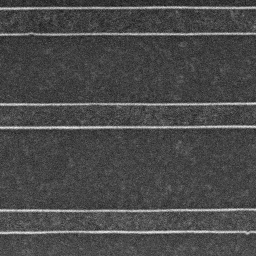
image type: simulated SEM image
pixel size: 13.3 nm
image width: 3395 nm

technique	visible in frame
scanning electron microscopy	one or a few lines or trenches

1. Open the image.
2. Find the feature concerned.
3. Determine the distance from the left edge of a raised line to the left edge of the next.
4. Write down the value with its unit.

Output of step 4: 1330 nm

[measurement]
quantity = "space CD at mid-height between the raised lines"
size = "1010 nm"